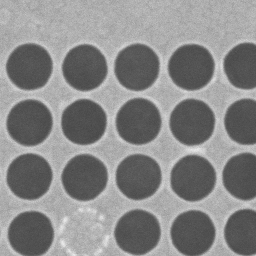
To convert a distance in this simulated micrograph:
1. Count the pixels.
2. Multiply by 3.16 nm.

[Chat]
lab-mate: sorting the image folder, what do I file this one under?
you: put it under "a regular array of holes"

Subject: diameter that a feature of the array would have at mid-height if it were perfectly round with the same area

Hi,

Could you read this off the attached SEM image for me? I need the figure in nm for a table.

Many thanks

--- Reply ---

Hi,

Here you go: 143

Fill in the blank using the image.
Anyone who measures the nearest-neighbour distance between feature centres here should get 170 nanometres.